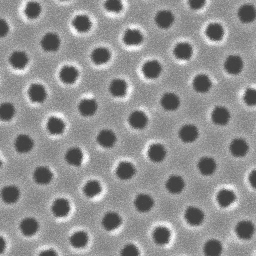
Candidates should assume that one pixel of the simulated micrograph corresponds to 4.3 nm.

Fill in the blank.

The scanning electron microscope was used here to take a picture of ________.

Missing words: a regular array of holes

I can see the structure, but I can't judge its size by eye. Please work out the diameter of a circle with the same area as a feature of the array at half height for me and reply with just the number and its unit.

83.4 nm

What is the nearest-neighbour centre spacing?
157 nm